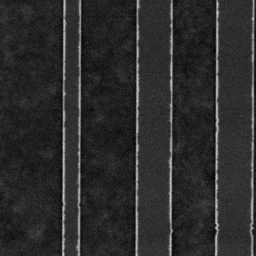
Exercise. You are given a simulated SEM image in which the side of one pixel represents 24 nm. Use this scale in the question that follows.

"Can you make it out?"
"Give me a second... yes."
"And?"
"one or a few lines or trenches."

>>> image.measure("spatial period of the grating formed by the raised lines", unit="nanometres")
1960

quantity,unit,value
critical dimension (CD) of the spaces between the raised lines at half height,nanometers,1220